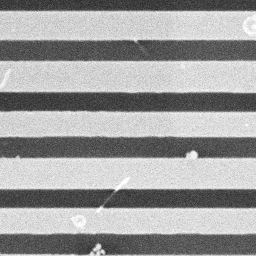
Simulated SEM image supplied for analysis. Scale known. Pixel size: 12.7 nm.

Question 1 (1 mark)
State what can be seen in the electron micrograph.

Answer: lines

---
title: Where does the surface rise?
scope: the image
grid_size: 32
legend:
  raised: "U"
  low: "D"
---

DDDDDDDDDDDDDDDDDDDDDDDDDDDDDDDD
UUUUUUUUUUUUUUUUUUUUUUUUUUUUUUUU
UUUUUUUUUUUUUUUUUUUUUUUUUUUUUUUU
UUUUUUUUUUUUUUUUUUUUUUUUUUUUUUUU
UUUUUUUUUUUUUUUUUUUUUUUUUUUUUUUU
DDDDDDDDDDDDDDDDDDDDDDDDDDDDDDDD
DDDDDDDDDDDDDDDDDDDDDDDDDDDDDDDD
DDDDDDDDDDDDDDDDDDDDDDDDDDDDDDDD
UUUUUUUUUUUUUUUUUUUUUUUUUUUUUUUU
UUUUUUUUUUUUUUUUUUUUUUUUUUUUUUUU
UUUUUUUUUUUUUUUUUUUUUUUUUUUUUUUU
DDDDDUUDDDDDDDDUUUUUUUUUUUDDUUUU
DDDDDDDDDDDDDDDDDDDDDDDDDDDDDDDD
DDDDDDDDDDDDDDDDDDDDDDDDDDDDDDDD
UUUUUUUUUUUUUUUUUUUUUUUUUUUUUUUU
UUUUUUUUUUUUUUUUUUUUUUUUUUUUUUUU
UUUUUUUUUUUUUUUUUUUUUUUUUUUUUUUU
DDDDDDDDDDDDDDDDDDDDDDDDDDDDDDDD
DDDDDDDDDDDDDDDDDDDDDDDDDDDDDDDD
DDDDDDDDDDDDDDDDDDDDDDDUUDDDDDDD
UUUUUUUUUUUUUUUUUUUUUUUUUUUUUUUU
UUUUUUUUUUUUUUUUUUUUUUUUUUUUUUUU
UUUUUUUUUUUUUUUUUUUUUUUUUUUUUUUU
UUUUUUUUUUUUUUUUUUUUUUUUUUUUUUUU
DDDDDDDDDDDDDDDDDDDDDDDDDDDDDDDD
DDDDDDDDDDDDDDDDDDDDDDDDDDDDDDDD
UUUUUUUUUUUUUUUUUUUUUUUUUUUUUUUU
UUUUUUUUUUUUUUUUUUUUUUUUUUUUUUUU
UUUUUUUUUUUUUUUUUUUUUUUUUUUUUUUU
DDDDDDDDDDDDDDDDDDDDDDDDDDDDDDDD
DDDDDDDDDDDDDDDDDDDDDDDDDDDDDDDD
DDDDDDDDDDDDUDDDDDDDDDDDDDDDDDDD